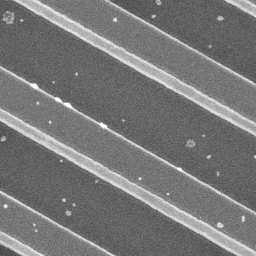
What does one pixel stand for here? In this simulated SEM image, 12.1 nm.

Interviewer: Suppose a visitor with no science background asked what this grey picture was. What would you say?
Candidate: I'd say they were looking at lines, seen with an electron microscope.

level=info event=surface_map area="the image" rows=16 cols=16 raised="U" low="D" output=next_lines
DDUUUUUUDDDDDDDU
DDDDUUUUUDDDDDDD
DDDDDUUUUUUDDDDD
DDDDDDDUUUUUUDDD
UDDDDDDDDUUUUUUD
UUDDDDDDDDDUUUUU
UUUUDDDDDDDDUUUU
UUUUUUDDDDDDDDUU
DDUUUUUUDDDDDDDD
DDDDUUUUUDDDDDDD
DDDDDUUUUUUDDDDD
DDDDDDDUUUUUUDDD
UDDDDDDDDUUUUUDD
UUUDDDDDDDDUUUUU
UUUUDDDDDDDDUUUU
DUUUUUDDDDDDDDUU